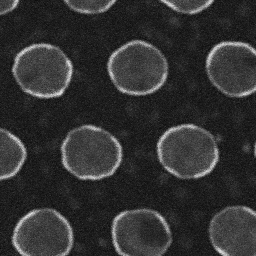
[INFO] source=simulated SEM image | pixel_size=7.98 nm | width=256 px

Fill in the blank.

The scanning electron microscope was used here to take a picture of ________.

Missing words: raised bodies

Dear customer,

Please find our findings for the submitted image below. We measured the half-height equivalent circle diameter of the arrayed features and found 446 nanometers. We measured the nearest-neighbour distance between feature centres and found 760 nm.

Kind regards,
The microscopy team